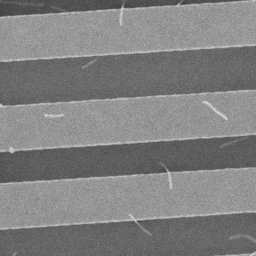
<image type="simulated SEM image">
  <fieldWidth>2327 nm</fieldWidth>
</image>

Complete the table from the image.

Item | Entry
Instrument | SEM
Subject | lines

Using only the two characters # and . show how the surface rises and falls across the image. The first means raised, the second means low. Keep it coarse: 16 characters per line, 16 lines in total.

........########
################
################
######..........
................
................
..##############
################
###############.
................
................
################
################
#############...
................
................